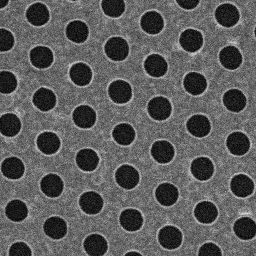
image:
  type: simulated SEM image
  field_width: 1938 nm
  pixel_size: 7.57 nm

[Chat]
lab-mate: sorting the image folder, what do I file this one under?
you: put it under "a regular array of holes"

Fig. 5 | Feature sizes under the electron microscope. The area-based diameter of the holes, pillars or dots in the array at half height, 186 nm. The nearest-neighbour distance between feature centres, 323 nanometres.